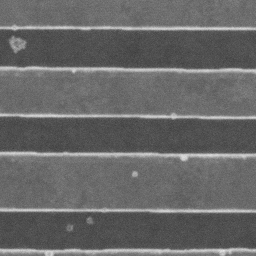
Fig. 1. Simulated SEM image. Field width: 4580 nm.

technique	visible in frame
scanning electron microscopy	lines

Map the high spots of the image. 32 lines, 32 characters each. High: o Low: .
oooooooooooooooooooooooooooooooo
oooooooooooooooooooooooooooooooo
oooooooooooooooooooooooooooooooo
oooooooooooooooooooooooooooooooo
................................
................................
................................
................................
o...............................
oooooooooooooooooooooooooooooooo
oooooooooooooooooooooooooooooooo
oooooooooooooooooooooooooooooooo
oooooooooooooooooooooooooooooooo
oooooooooooooooooooooooooooooooo
......oooooooooooooooooooooooooo
................................
................................
................................
................................
oooooooooooooooooooooooooooooooo
oooooooooooooooooooooooooooooooo
oooooooooooooooooooooooooooooooo
oooooooooooooooooooooooooooooooo
oooooooooooooooooooooooooooooooo
oooooooooooooooooooooooooooooooo
oooooooooooooooooooooooooooooooo
................................
................................
................................
................................
................................
oooooooooooooooooooooooooooooooo